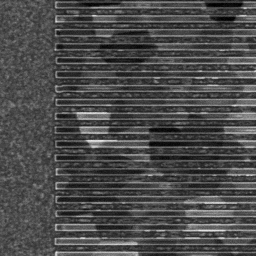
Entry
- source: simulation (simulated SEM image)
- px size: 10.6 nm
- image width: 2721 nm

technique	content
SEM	parallel lines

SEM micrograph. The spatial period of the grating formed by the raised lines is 148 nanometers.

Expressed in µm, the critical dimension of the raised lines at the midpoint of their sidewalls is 0.0717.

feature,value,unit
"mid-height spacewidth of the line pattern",0.0797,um